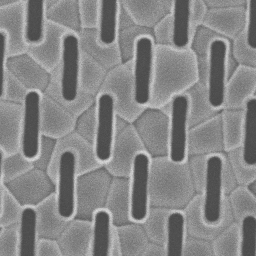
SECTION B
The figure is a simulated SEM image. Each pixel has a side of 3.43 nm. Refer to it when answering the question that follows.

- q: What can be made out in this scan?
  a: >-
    a regular array of holes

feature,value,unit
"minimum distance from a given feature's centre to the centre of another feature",235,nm